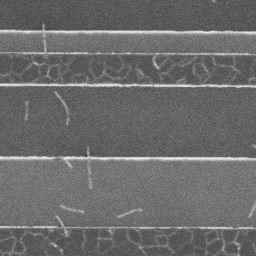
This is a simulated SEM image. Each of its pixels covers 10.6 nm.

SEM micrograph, lines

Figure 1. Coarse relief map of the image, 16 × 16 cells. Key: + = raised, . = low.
................
................
++++++++++++++++
++++++++++++++++
++++++++++++++++
................
................
................
................
................
++++++++++++++++
++++++++++++++++
++++++++++++++++
++++++++++++++++
++++++++++++++++
++++++++++++++++